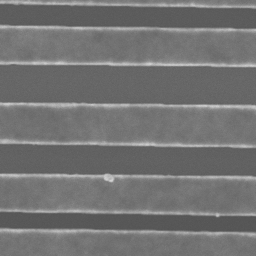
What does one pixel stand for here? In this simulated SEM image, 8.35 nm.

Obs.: lines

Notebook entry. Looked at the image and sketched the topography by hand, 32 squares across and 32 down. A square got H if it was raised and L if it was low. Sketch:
LLLLHHHHHHHHHHHHHHHHHHHHHHHHHHHH
LLLLLLLLLLLLLLLLLLLLLLLLLLLLLLLL
LLLLLLLLLLLLLLLLLLLLLLLLLLLLLLLL
HHHHHHHHHHHHHHHHHHHLLLLLLLLLLLLL
HHHHHHHHHHHHHHHHHHHHHHHHHHHHHHHH
HHHHHHHHHHHHHHHHHHHHHHHHHHHHHHHH
HHHHHHHHHHHHHHHHHHHHHHHHHHHHHHHH
HHHHHHHHHHHHHHHHHHHHHHHHHHHHHHHH
LLLLLLLLLLLLLLLLLLLLLLLLLLLLLLLL
LLLLLLLLLLLLLLLLLLLLLLLLLLLLLLLL
LLLLLLLLLLLLLLLLLLLLLLLLLLLLLLLL
LLLLLLLLLLLLLLLLLLLLLLLLLLLLLLLL
LLLLLLLLLLLLLLLLLLLLLLLLLLLLLLLL
HHHHHHHHHHHHHHHHHHHHHHHHHHHHHHHH
HHHHHHHHHHHHHHHHHHHHHHHHHHHHHHHH
HHHHHHHHHHHHHHHHHHHHHHHHHHHHHHHH
HHHHHHHHHHHHHHHHHHHHHHHHHHHHHHHH
HHHHHHHHHHHHHHHHHHHHHHHHHHHHHHHH
LLLLLLLLLLLLLLLLLLLLLLLLLLLLLLLL
LLLLLLLLLLLLLLLLLLLLLLLLLLLLLLLL
LLLLLLLLLLLLLLLLLLLLLLLLLLLLLLLL
LLLLLLLLLLLLLLLLLLLLLLLLLLLLLLLL
HHHHHHHHHHHHHHHHHHHHHHHHHHHHHHHH
HHHHHHHHHHHHHHHHHHHHHHHHHHHHHHHH
HHHHHHHHHHHHHHHHHHHHHHHHHHHHHHHH
HHHHHHHHHHHHHHHHHHHHHHHHHHHHHHHH
LLLHHHHHHHHHHHHHHHHHHHHHHHHHHHHH
LLLLLLLLLLLLLLLLLLLLLLLLLLLLLLLL
LLLLLLLLLLLLLLLLLLLLLLLLLLLLLLLL
HHHHHHHHHHHHHHHHHHHHHHHHHHHHHHHH
HHHHHHHHHHHHHHHHHHHHHHHHHHHHHHHH
HHHHHHHHHHHHHHHHHHHHHHHHHHHHHHHH